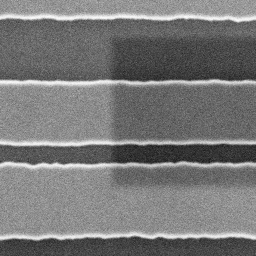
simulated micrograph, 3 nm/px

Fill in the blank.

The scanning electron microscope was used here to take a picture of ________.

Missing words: lines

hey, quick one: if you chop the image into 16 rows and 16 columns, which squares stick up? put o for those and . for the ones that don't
oooooooooooooooo
................
................
................
................
oooooooooooooooo
oooooooooooooooo
oooooooooooooooo
oooooooooooooooo
oooooooooooooooo
oooooooooooooooo
oooooooooooooooo
oooooooooooooooo
oooooooooooooooo
oooooooooooooooo
................